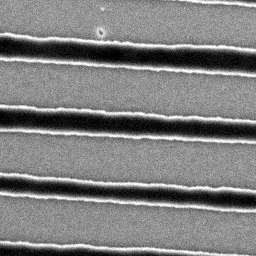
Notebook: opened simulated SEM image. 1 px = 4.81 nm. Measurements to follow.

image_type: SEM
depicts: lines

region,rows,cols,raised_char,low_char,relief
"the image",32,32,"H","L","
LLLLLLLLLLLLLLLLLLLLLLLLLLLLLHHH
LLLLLLLLLLLLLLLLLLLLLLLLLLLLLLLL
LLLLLLLLLLLLLLLLLLLLLLLLLLLLLLLL
LLLLLLLLLLLLLLLLLLLLLLLLLLLLLLLL
HHHLLLLLLLLLLLLLLLLLLLLLLLLLLLLL
HHHHHHHHHHHHHHHHHLLLLLLLLLLLLLLL
HHHHHHHHHHHHHHHHHHHHHHHHHHHHHHHH
HHHHHHHHHHHHHHHHHHHHHHHHHHHHHHHH
LLLLLLLLLLLLLLLLHHHHHHHHHHHHHHHH
LLLLLLLLLLLLLLLLLLLLLLLLLLLLLLLL
LLLLLLLLLLLLLLLLLLLLLLLLLLLLLLLL
LLLLLLLLLLLLLLLLLLLLLLLLLLLLLLLL
LLLLLLLLLLLLLLLLLLLLLLLLLLLLLLLL
HHHHLLLLLLLLLLLLLLLLLLLLLLLLLLLL
HHHHHHHHHHHHHHHHHHHHHLLLLLLLLLLL
HHHHHHHHHHHHHHHHHHHHHHHHHHHHHHHH
LLLLLHHHHHHHHHHHHHHHHHHHHHHHHHHH
LLLLLLLLLLLLLLLLLLLLLLLLLHHHHHHH
LLLLLLLLLLLLLLLLLLLLLLLLLLLLLLLL
LLLLLLLLLLLLLLLLLLLLLLLLLLLLLLLL
LLLLLLLLLLLLLLLLLLLLLLLLLLLLLLLL
LLLLLLLLLLLLLLLLLLLLLLLLLLLLLLLL
HHHHHHHHHHLLLLLLLLLLLLLLLLLLLLLL
HHHHHHHHHHHHHHHHHHHHHHHHHHLLLLLL
LLLHHHHHHHHHHHHHHHHHHHHHHHHHHHHH
LLLLLLLLLLLLLLLLLLHHHHHHHHHHHHHH
LLLLLLLLLLLLLLLLLLLLLLLLLLLLLLLL
LLLLLLLLLLLLLLLLLLLLLLLLLLLLLLLL
LLLLLLLLLLLLLLLLLLLLLLLLLLLLLLLL
LLLLLLLLLLLLLLLLLLLLLLLLLLLLLLLL
HHHHLHLLLLLLLLLLLLLLLLLLLLLLLLLL
HHHHHHHHHHHHHHHHHHHHHHHHLLLLLLLL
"